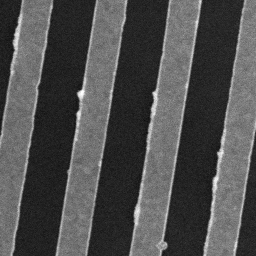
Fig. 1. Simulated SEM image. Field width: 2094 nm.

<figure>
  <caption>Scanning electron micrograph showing one or a few lines or trenches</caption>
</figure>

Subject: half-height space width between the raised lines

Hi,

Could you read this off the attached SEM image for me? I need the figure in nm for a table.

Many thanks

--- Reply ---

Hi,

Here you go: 349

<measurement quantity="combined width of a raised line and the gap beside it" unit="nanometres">598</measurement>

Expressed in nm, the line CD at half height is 251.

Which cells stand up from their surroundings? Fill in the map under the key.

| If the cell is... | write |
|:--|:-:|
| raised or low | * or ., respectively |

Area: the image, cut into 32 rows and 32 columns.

...****.....****.....****......*
...***......****.....****.....**
..****......****.....****.....**
..****......***......****.....**
..****.....****......***......**
..****.....****.....****......**
..***......****.....****......**
..***......****.....****.....***
.****......***......****.....***
.****......***......****.....***
.****.....****......***......***
.****.....****.....****......***
.****.....****.....****......***
.***......****.....****.....****
****......****.....****.....****
****......***......****.....****
****......***......***......****
****.....****.....****......****
****.....****.....****......***.
***......****.....****.....****.
***......****.....****.....****.
***......***......****.....****.
***......***......****.....****.
***.....****......***......****.
***.....****.....****......****.
**......****.....****.....****..
**......****.....****.....****..
**......***......****.....****..
**......***......****.....****..
**.....****......***......****..
**.....****.....*****.....****..
**.....****.....****.....****...